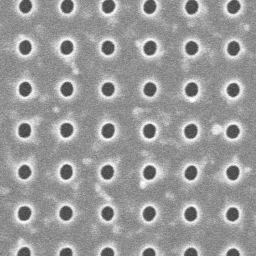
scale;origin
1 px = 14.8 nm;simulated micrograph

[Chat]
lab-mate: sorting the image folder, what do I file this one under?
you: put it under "a regular array of holes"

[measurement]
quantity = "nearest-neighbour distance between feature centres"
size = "610 nanometres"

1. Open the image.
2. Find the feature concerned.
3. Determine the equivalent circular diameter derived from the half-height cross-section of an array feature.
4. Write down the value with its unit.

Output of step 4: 218 nm